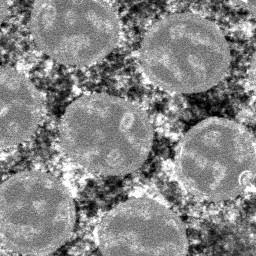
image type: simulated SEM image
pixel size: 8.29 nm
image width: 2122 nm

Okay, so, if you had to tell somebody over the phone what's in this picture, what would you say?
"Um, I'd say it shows raised bodies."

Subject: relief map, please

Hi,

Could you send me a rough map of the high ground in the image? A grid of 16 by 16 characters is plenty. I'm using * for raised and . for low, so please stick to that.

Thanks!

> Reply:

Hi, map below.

..*****.........
..*****...***...
..*****..*****..
....**...*****..
.........*****..
**.........*....
**...***........
**..*****.......
*...*****...***.
....*****..*****
......**...*****
.***........***.
****............
****...****.....
****..*****.....
.**...*****.....